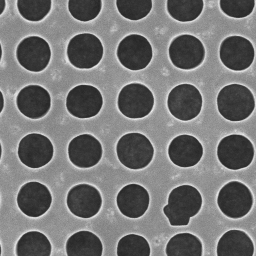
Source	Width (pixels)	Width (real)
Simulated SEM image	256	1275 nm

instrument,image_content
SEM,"a regular array of holes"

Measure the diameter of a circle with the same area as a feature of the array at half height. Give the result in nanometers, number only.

176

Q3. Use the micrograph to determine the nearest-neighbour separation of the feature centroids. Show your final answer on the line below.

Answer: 244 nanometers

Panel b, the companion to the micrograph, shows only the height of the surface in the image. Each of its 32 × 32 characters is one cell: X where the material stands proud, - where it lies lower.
-X----XXX----XX----XX----XXX----
XX----XXX---XXX----XX----XXX---X
XXXX-XXXXX-XXXXX-XXXXX--XXXXXXXX
XXXXXXXXXXXXXXXXXXXXXXXXXXXXXXXX
XXXXXXXXX---XXXX--XXXXX-XXXXX-XX
XX----XXX----XX----XX----XXX---X
XX----XX-----XX----XX-----X-----
XX----XXX----XX----XX----XXX----
XXX---XXXX-XXXXX--XXXX--XXXXX--X
XXXXXXXXXXXXXXXXXXXXXXXXXXXXXXXX
XXXXXXXXXXXXXXXXXXXXXXXXXXXXX-XX
XX----XXX---XXX----XX----XX----X
XX----XX-----XX----XX----XX-----
XX----XX-----XX----XX----XX-----
XXX--XXXX---XXXX--XXXX---XXX---X
XXXXXXXXXXXXXXXXXXXXXXXXXXXXXXXX
XXXXXXXXXXXXXXXXXXXXXXXXXXXXXXXX
XXX---XXX---XXX----XXX---XXX---X
XX-----XX----XX----XX----XX-----
XX-----XX----XX----XX----XX-----
XXX---XXX---XXX----XXX--XXXX---X
XXXXXXXXXXXXXXXXXXXXXXXXXXXXXXXX
XXXXXXXXXXXXXXXXXXXXXXXXXXXXXXXX
XXX---XXX---XXX---XXXX--XXXX---X
XX----XX-----XX----XX----XX----X
XX----XX-----XX----XX----XX----X
XXX---XXX---XXX---XXX----XXX---X
XXXXXXXXXXXXXXXXXXXXX---XXXXXXXX
XXXXXXXXXXXXXXXXXXXXXXXXXXXXXXXX
XXX---XXX---XXXX--XXXX--XXXX---X
XX----XX-----XX----XX----XX-----
XX----XX-----XX----XX----XX-----